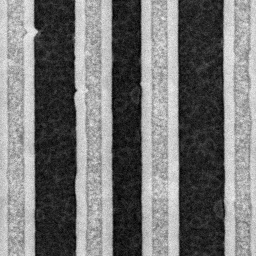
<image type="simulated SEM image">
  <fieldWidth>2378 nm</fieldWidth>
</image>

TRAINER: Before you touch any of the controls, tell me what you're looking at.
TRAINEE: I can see one or a few lines or trenches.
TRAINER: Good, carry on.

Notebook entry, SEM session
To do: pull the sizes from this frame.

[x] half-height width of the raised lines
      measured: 0.237 micrometres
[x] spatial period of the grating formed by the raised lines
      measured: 0.689 µm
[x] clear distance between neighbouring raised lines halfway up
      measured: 482 nm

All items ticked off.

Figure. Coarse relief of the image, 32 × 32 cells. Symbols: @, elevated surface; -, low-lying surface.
@@@-------@@@-----@@@@-------@@@
@@@-------@@@-----@@@@-------@@@
@@@-------@@@-----@@@@-------@@@
@@@@------@@@-----@@@@-------@@@
@@@@------@@@-----@@@@-------@@@
@@@-------@@@-----@@@@-------@@@
@@@@------@@@-----@@@@-------@@@
@@@@------@@@-----@@@@-------@@@
@@@@------@@@-----@@@@-------@@@
@@@@------@@@-----@@@@-------@@@
@@@@------@@@-----@@@@-------@@@
@@@@------@@@-----@@@@-------@@@
@@@@------@@@-----@@@@-------@@@
@@@@------@@@-----@@@@-------@@@
@@@@------@@@-----@@@@-------@@@
@@@@------@@@-----@@@@-------@@@
@@@@------@@@-----@@@@-------@@@
@@@@------@@@-----@@@@-------@@@
@@@@------@@@------@@@-------@@@
@@@@------@@@-----@@@@-------@@@
@@@@------@@@------@@@-------@@@
@@@@------@@@------@@@-------@@@
@@@@------@@@------@@@-------@@@
@@@@------@@@-----@@@@-------@@@
@@@@------@@@-----@@@@-------@@@
@@@@------@@@-----@@@@-------@@@
@@@@------@@@-----@@@@-------@@@
@@@@------@@@-----@@@@-------@@@
@@@@------@@@------@@@-------@@@
@@@@------@@@-----@@@@-------@@@
@@@@------@@@-----@@@@-------@@@
@@@@------@@@-----@@@@-------@@@